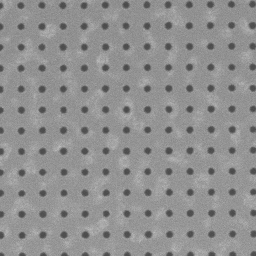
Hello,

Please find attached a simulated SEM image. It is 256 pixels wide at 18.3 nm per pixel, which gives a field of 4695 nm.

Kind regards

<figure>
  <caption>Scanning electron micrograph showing a regular array of holes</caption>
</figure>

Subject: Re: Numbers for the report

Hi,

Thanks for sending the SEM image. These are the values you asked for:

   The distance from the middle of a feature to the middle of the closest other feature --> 379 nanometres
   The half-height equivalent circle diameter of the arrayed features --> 134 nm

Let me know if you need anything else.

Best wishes